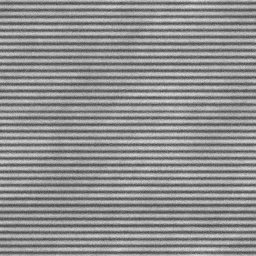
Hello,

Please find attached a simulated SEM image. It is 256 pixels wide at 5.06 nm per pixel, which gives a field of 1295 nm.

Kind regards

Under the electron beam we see parallel lines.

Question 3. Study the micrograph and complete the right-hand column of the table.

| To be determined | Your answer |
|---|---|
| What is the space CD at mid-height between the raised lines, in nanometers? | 17.1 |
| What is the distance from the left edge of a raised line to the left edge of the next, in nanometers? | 34.1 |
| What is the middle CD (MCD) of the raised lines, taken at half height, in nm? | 17.1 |